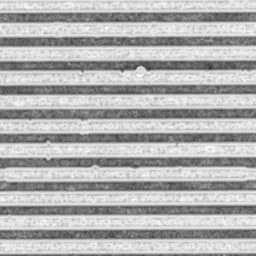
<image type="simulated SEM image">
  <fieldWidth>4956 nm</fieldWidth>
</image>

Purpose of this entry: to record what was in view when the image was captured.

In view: parallel lines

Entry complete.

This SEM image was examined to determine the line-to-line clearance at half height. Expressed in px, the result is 11.6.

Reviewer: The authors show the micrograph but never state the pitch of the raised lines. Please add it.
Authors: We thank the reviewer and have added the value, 466 nm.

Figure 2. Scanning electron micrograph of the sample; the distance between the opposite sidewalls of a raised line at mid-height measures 244 nanometres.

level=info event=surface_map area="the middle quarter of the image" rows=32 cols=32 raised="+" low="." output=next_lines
................................
..................++............
++++++++++++++++++++++++++++++++
++++++++++++++++++++++++++++++++
++++++++++++++++++++++++++++++++
................................
................................
................................
++++++++++++++++++++++++++++++++
++++++++++++++++++++++++++++++++
++++++++++++++++++++++++++++++++
................................
................................
................................
++++++++++++++++++++++++++++++++
++++++++++++++++++++++++++++++++
++++++++++++++++++++++++++++++++
................................
................................
................................
++++++++++++++++++++++++++++++++
++++++++++++++++++++++++++++++++
++++++++++++++++++++++++++++++++
................................
................................
................................
++++++++++++++++++++++++++++++++
++++++++++++++++++++++++++++++++
++++++++++++++++++++++++++++++++
................................
................................
................................